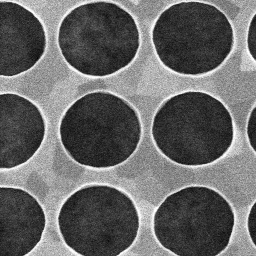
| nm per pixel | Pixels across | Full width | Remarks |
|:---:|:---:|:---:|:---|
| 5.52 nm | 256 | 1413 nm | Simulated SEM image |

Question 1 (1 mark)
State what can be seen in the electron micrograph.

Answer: holes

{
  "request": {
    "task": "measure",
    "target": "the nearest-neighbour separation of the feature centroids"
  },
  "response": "504 nm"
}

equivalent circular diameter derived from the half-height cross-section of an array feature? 0.426 µm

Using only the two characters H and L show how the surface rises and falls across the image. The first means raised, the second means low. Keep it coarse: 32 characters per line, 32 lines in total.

LLHHHHHHHHHLLLHHHHHHHHLLLLHHHHHH
LLLLHHHHHLLLLLLLHHHHLLLLLLLLHHHH
LLLLLHHHLLLLLLLLLHHHLLLLLLLLHHHL
LLLLLHHLLLLLLLLLLHHLLLLLLLLLLHHL
LLLLLLHLLLLLLLLLLHHLLLLLLLLLLHHL
LLLLLLHLLLLLLLLLLHHLLLLLLLLLLHHL
LLLLLHHHLLLLLLLLLHHHLLLLLLLLLHHL
LLLLLHHHLLLLLLLLHHHHLLLLLLLLHHHH
LLLLHHHHHLLLLLLHHHHHHLLLLLLHHHHH
HLHHHHHHHHHHLHHHHHHHHHHHHHHHHHHH
HHHHHHHHHHHHHHHHHHHHHHHHHHHHHHHH
HHHHHHHHHHHHLHHHHHHHHHHLLHHHHHHH
LLLHHHHHHHLLLLLLHHHHHLLLLLLHHHHH
LLLLLHHHHLLLLLLLLHHHLLLLLLLLHHHH
LLLLLHHHLLLLLLLLLHHLLLLLLLLLLHHL
LLLLLLHHLLLLLLLLLHHLLLLLLLLLLHHL
LLLLLLHHLLLLLLLLLLHLLLLLLLLLLHHL
LLLLLHHHLLLLLLLLLHHLLLLLLLLLLHHL
LLLLLHHHLLLLLLLLLHHHLLLLLLLLLHHH
LLLLHHHHHLLLLLLLHHHHHLLLLLLLHHHH
LLLHHHHHHHLLLLLHHHHHHHHLLHHHHHHH
HHHHHHHHHHHHHHHHHHHHHHHHHHHHHHHH
HHHHHHHHHHHHHHHHHHHHHHHHHHHHHHHH
LLHHHHHHHHLLLLHHHHHHHHHLLLHHHHHH
LLLLHHHHHLLLLLLLHHHHHLLLLLLLHHHH
LLLLLHHHLLLLLLLLLHHHLLLLLLLLLHHH
LLLLLHHLLLLLLLLLLHHLLLLLLLLLLHHL
LLLLLLHLLLLLLLLLLHHLLLLLLLLLLHHL
LLLLLHHLLLLLLLLLLHHLLLLLLLLLLHHL
LLLLLHHHLLLLLLLLLHHLLLLLLLLLLHHL
LLLLLHHHLLLLLLLLHHHHLLLLLLLLLHHH
LLLLHHHHHHLLLLLHHHHHHHLLLLLLHHHH